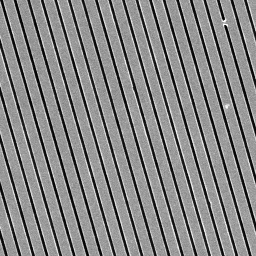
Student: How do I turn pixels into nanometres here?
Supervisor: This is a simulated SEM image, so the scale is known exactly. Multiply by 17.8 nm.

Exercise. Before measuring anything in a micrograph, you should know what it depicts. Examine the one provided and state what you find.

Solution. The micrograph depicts parallel lines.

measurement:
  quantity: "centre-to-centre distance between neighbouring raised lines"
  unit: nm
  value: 232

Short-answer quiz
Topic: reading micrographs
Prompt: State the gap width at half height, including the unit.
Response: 53.6 nm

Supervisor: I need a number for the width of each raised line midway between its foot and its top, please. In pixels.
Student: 9.98